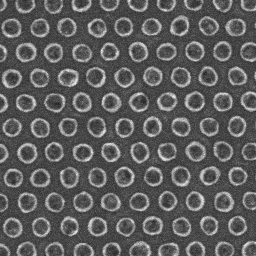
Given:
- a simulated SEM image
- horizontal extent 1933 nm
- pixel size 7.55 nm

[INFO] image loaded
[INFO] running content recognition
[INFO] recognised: a regular array of raised bodies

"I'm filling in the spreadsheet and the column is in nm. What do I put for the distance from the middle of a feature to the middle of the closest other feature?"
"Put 208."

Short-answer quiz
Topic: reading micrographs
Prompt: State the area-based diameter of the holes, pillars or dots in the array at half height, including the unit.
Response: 0.131 µm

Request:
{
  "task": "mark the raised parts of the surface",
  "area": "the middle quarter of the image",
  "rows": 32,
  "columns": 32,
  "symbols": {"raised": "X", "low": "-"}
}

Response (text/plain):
--------------------------------
------XXX-----XX-----XX-----XX--
XXX---XXXX---XXXX---XXXX---XXXX-
XXX---XXXX---XXXX---XXXX---XXXX-
XXX---XXX----XXXX----XXX---XXXX-
-------X------XX-------------X--
--------------------------------
----X---------------------------
---XXX----XXX----XXXX---XXXX---X
---XXXX---XXXX---XXXX---XXXX---X
---XXXX---XXXX---XXXX---XXXX---X
----X-------------XX------------
--------------------------------
--------------------------------
XXX---XXXX----XXX----XXX----XXX-
XXX---XXXX---XXXX---XXXX---XXXX-
XXX---XXXX---XXXX---XXXX---XXXX-
XX-----XXX----XXX----XXX----XXX-
--------------------------------
--------------------------------
----XX----XXX----XXX----XXX----X
---XXXX---XXXX---XXXX---XXXX---X
---XXXX---XXXX---XXXX---XXXX---X
---XXXX---XXX-----XXX----XX-----
--------------------------------
--------------------------------
XXX----XX-----XX-----XX-----XXX-
XXX---XXXX---XXXX---XXXX---XXXX-
XXX---XXXX---XXXX---XXXX---XXXX-
XXX----XXX---XXXX----XXX----XXX-
--------------------------------
--------------------------------